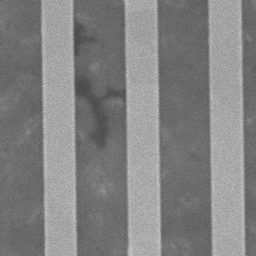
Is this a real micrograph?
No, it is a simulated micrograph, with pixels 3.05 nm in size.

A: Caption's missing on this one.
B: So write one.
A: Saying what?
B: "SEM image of one or a few lines or trenches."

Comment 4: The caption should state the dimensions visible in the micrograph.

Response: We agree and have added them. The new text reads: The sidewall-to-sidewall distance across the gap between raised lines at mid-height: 0.159 um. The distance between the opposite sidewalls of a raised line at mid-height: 95.6 nm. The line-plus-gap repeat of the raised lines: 256 nanometers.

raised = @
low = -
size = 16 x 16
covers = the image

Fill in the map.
---@@---@@---@@-
---@@---@@---@@-
---@@---@@---@@-
---@@---@@---@@-
---@@---@@---@@-
---@@---@@---@@-
---@@---@@---@@-
---@@---@@---@@-
---@@---@@---@@-
---@@---@@---@@-
---@@---@@---@@-
---@@---@@---@@-
---@@---@@---@@-
---@@---@@---@@-
---@@---@@---@@-
---@@---@@---@@-